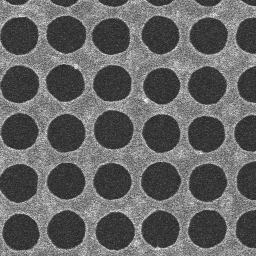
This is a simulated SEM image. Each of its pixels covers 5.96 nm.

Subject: a regular array of holes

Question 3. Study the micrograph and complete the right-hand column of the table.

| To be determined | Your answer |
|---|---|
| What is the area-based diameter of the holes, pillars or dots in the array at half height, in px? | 37.9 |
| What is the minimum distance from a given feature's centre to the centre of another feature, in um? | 0.272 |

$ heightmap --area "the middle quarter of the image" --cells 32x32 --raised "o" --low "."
..ooooooooo...oooooooooooooooooo
...oooooo......ooooooo.....ooooo
....oooo........ooooo.......oooo
.....ooo.........ooo.........oo.
.....oo..........ooo.........oo.
.....oo..........ooo.........oo.
.....oo..........ooo.........oo.
....oooo........oooo........ooo.
...oooooo......oooooo.......oooo
oooooooooooooooooooooo.....ooooo
oooooooooooooooooooooooooooooooo
oooooooooooooooooooooooooooooooo
.oooooooo......ooooooooo.ooooooo
...ooooo........oooooo.....ooooo
.....ooo.........ooo........oooo
.....ooo.........ooo.........oo.
.....oo..........ooo.........oo.
.....oo..........ooo.........oo.
.....ooo.........ooo.........oo.
.....ooo.........ooo.........oo.
....ooooo......oooooo.......oooo
...ooooooooooooooooooo.....ooooo
oooooooooooooooooooooooooooooooo
oooooooooooooooooooooooooooooooo
ooooooooooooooooooooooo..ooooooo
...oooooo.....ooooooo......ooooo
....oooo........oooo........oooo
.....ooo........oooo.........ooo
.....oo..........oo..........oo.
.....oo..........oo..........oo.
.....oo..........oo..........oo.
.....ooo.........ooo.........oo.